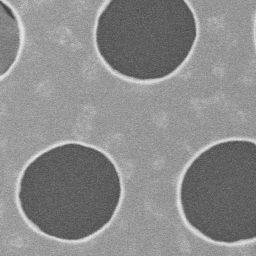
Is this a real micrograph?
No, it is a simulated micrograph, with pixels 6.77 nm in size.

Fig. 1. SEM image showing holes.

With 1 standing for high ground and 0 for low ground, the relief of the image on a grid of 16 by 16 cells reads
0111111000001111
0111110000001111
0111110000001111
0111110000001111
1111111000011111
1111111111111111
1111111111111111
1111111111111111
1111111111111111
1110001111111000
1100000111110000
1000000011100000
1000000111100000
1100000111110000
1110001111110000
1111111111111111